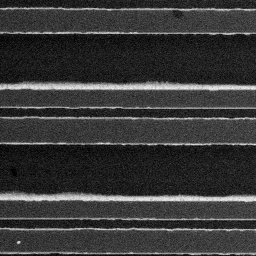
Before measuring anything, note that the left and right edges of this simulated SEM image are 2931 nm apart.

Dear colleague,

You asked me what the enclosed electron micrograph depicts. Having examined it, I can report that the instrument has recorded lines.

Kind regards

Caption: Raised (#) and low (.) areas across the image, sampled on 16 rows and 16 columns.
################
################
................
................
................
###########.....
################
################
################
................
................
................
########........
################
################
################